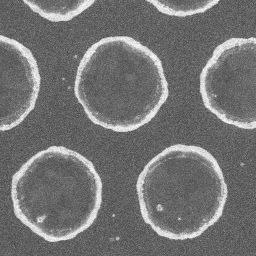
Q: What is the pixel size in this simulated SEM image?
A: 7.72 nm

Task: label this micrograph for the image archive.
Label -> raised bodies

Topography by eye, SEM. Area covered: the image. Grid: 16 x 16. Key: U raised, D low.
DDUUUDDDDDUUUDDD
DDDDDDDDDDDDDDDD
DDDDDDDUDDDDDDDU
UUDDDUUUUUDDDUUU
UUDDDUUUUUDDDUUU
UUDDDUUUUUDDDUUU
UUDDDUUUUUDDDUUU
UDDDDDUUUDDDDDUU
DDDDDDDDDDDDDDDD
DDDUDDDDDDUUUDDD
DDUUUUDDDUUUUUDD
DUUUUUDDDUUUUUDD
DUUUUUDDDUUUUUDD
DUUUUUDDDUUUUUDD
DDUUUDDDDDUUUDDD
DDDDDDDDDDDDDDDD